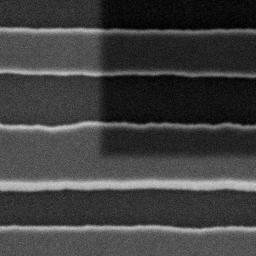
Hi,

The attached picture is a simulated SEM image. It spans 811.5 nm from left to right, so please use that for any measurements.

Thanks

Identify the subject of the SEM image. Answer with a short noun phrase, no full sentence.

lines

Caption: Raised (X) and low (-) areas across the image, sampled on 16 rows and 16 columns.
----------------
----------------
XXXXXXXXXXXXXXXX
XXXXXXXXXXXXXXXX
XXXXXXXXXXXXXXXX
----------------
----------------
----------------
XXXXXXXXXXXXXXXX
XXXXXXXXXXXXXXXX
XXXXXXXXXXXXXXXX
XXXXXXXXXXXXXXXX
----------------
----------------
XXXXXXXXXXXXXXXX
XXXXXXXXXXXXXXXX